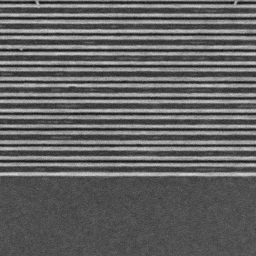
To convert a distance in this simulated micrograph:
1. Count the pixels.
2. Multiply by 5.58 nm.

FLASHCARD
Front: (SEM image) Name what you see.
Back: parallel lines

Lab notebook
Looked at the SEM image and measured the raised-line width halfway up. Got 2.63 pixels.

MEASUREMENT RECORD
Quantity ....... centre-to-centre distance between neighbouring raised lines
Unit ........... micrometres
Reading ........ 0.0448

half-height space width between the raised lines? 33.5 nanometres